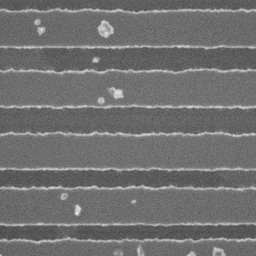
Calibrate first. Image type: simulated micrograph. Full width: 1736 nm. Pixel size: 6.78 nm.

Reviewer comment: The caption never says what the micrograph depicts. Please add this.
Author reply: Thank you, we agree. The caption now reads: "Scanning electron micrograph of lines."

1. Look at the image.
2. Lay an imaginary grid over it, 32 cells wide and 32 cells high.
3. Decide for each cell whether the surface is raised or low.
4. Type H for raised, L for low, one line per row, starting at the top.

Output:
LLLLLLLLLLLLLLLLLLLLLLLLLLLLLLLL
HHHHHHHHHHHHHHHHHHHHHHHHHHHHHHHH
HHHHHHHHHHHHHHHHHHHHHHHHHHHHHHHH
HHHHHHHHHHHHHHHHHHHHHHHHHHHHHHHH
HHHHHHHHHHHHHHHHHHHHHHHHHHHHHHHH
HHHHHHHHHHHHHHHHHHHHHHHHHHHHHHHH
LLLLLLLLLLLLLLLLLLLLLLLLLLLLLLLL
LLLLLLLLLLLLLLLLLLLLLLLLLLLLLLLL
LLLLLLLLLLLLLLLLLLLLLLLLLLLLLLLL
HHHHHHHHHHHHHHHHHHHHHHHHHHHHHHHH
HHHHHHHHHHHHHHHHHHHHHHHHHHHHHHHH
HHHHHHHHHHHHHHHHHHHHHHHHHHHHHHHH
HHHHHHHHHHHHHHHHHHHHHHHHHHHHHHHH
LLLLLLLHLLLLLLLLLLLLLLLLLLLLHLHL
LLLLLLLLLLLLLLLLLLLLLLLLLLLLLLLL
LLLLLLLLLLLLLLLLLLLLLLLLLLLLLLLL
LLLLLLLLLLLLLLLLLLLLLLLLLLLLLLLL
HHHHHHHHHHHHHHHHHHHHHHHHHHHHHHHH
HHHHHHHHHHHHHHHHHHHHHHHHHHHHHHHH
HHHHHHHHHHHHHHHHHHHHHHHHHHHHHHHH
HHHHHHHHHHHHHHHHHHHHHHHHHHHHHHHH
LLLLLLLLLLLLLLLLLLLLLLLLLLLLLLLL
LLLLLLLLLLLLLLLLLLLLLLLLLLLLLLLL
HHLLHHHHLHHHHLHHHHHLHHLHLLLLLLLH
HHHHHHHHHHHHHHHHHHHHHHHHHHHHHHHH
HHHHHHHHHHHHHHHHHHHHHHHHHHHHHHHH
HHHHHHHHHHHHHHHHHHHHHHHHHHHHHHHH
HHHHHHHHHHHHHHHHHHHHHHHHHHHHHHHH
LLLLLLLLLLLLLLLLLLLLLLLLLLLLLLLL
LLLLLLLLLLLLLLLLLLLLLLLLLLLLLLLL
HHHHHHHHHHHHHHHHHHHHHHHHHHHHHHHH
HHHHHHHHHHHHHHHHHHHHHHHHHHHHHHHH